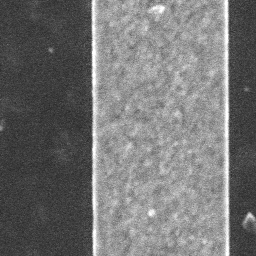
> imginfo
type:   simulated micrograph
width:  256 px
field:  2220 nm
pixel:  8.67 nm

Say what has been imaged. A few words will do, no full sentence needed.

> one or a few lines or trenches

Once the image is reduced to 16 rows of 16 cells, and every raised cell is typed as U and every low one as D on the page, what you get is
DDDDDDUUUUUUUUDD
DDDDDDUUUUUUUUDD
DDDDDDUUUUUUUUDD
DDDDDDUUUUUUUUDD
DDDDDDUUUUUUUUDD
DDDDDDUUUUUUUUDD
DDDDDDUUUUUUUUDD
DDDDDDUUUUUUUUDD
DDDDDDUUUUUUUUDD
DDDDDDUUUUUUUUDD
DDDDDDUUUUUUUUDD
DDDDDDUUUUUUUUDD
DDDDDDUUUUUUUUDD
DDDDDDUUUUUUUUDD
DDDDDDUUUUUUUUDD
DDDDDDUUUUUUUUDD